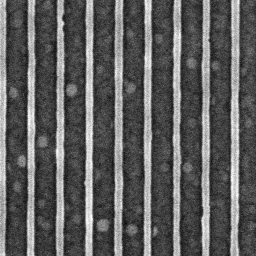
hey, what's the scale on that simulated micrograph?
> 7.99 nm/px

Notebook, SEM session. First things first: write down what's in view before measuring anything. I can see parallel lines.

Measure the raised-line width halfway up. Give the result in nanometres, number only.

48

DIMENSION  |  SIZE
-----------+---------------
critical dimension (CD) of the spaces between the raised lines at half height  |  182 nm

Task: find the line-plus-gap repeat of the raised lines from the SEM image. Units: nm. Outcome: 233